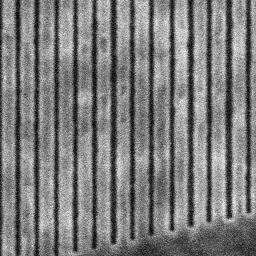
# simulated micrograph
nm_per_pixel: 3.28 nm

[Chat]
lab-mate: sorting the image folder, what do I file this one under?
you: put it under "parallel lines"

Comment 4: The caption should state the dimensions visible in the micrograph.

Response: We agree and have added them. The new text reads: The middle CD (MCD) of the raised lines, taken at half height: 0.0455 micrometres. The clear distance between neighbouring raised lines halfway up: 16.4 nm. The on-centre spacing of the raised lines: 62.9 nm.